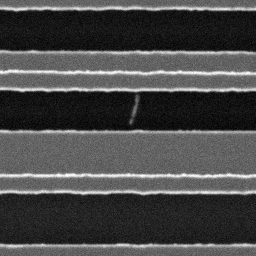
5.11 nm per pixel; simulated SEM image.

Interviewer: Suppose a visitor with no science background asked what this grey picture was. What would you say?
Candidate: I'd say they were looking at lines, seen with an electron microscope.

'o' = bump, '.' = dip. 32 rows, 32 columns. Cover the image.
oooooooooooooooooooooooooooooooo
................................
................................
................................
................................
................................
ooooooooooooooooooooooooooooooo.
oooooooooooooooooooooooooooooooo
oooooooooooooooooooooooooooooooo
oooooooooooooooooooooooooooooooo
oooooooooooooooooooooooooooooooo
................................
................................
................................
................................
................................
oooooooooooooooooooooooooooooooo
oooooooooooooooooooooooooooooooo
oooooooooooooooooooooooooooooooo
oooooooooooooooooooooooooooooooo
oooooooooooooooooooooooooooooooo
oooooooooooooooooooooooooooooooo
oooooooooooooooooooooooooooooooo
oooooooooooooooooooooooooooooooo
................................
................................
................................
................................
................................
................................
................................
oooooooooooooooooooooooooooooooo